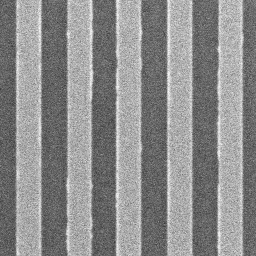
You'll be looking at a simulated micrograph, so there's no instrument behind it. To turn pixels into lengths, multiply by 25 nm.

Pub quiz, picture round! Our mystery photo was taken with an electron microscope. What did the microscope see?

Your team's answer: lines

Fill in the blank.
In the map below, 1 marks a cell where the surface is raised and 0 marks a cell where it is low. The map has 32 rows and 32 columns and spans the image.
00111000011000011100011100011100
00111000011000011100011100011100
00111000011000011100011100011100
00111000011000011100011100011100
00111000011000011100011100011100
00111000011000011100011100011100
00111000011000011100011100011100
00111000011000011100011100011100
00111000011000011100011100011100
00111000011000011100011100011100
00111000011000011100011100011100
00111000011000011100011100011100
00111000011000011100011100011100
00111000011000011100011100011100
00111000011000011100011100011100
00111000011000011100011100011100
00111000011000011100011100011100
00111000011000011100011100011100
00111000011000011100011100011100
00111000011000011100011100011100
00111000011000011100011100011100
00111000011000011100011100011100
00111000111000011100011100011100
00111000011000011100011100011100
00111000011000011100011100011100
00111000011000011100011100011100
00111000011000011100011100011100
00111000011000011100011100011100
00111000011000011100011100011100
00111000011000011100011100011100
00111000011000011100011100011100
00111000011000011100011100011100